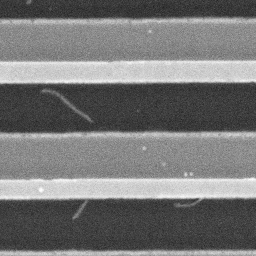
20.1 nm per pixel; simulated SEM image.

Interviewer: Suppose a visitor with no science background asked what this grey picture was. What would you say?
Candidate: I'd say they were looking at lines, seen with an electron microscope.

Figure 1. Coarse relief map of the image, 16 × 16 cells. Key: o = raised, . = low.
................
oooooooooooooooo
oooooooooooooooo
oooooooooooooooo
oooooooooooooooo
................
................
................
..............oo
oooooooooooooooo
oooooooooooooooo
oooooooooooooooo
................
................
................
................